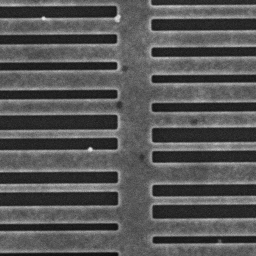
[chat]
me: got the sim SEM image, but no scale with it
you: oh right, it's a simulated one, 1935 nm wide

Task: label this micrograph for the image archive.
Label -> groups of lines, slits or small figures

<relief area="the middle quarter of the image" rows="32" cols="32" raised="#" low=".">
.............###################
.............###################
################################
######################..........
######################..........
################################
.............###################
..............##################
.............###################
#############################...
######################..........
######################..........
################################
..............##################
..............##################
..............##################
.............#########..........
######################..........
.............#########..........
..............########..........
..............##################
......#......###################
######################..........
######################..........
######################..........
################################
################################
..............##################
..............##################
.............###################
######################..........
######################..........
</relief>